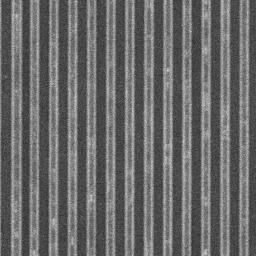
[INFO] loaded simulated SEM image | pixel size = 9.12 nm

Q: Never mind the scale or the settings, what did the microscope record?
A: parallel lines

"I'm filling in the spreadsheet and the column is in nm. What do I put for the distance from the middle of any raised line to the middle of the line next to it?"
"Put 173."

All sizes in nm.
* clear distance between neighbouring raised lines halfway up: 108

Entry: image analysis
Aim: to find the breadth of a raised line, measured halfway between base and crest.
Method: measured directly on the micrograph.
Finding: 0.0638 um